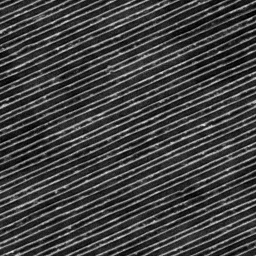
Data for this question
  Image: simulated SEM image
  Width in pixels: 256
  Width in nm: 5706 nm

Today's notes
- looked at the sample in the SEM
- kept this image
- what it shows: parallel lines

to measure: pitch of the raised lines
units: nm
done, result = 287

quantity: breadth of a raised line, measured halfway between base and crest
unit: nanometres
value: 137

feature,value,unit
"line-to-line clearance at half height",158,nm